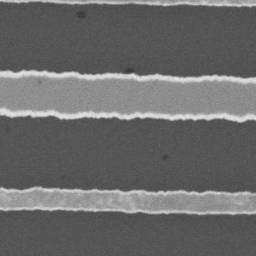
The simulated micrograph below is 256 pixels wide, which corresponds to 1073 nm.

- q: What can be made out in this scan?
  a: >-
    lines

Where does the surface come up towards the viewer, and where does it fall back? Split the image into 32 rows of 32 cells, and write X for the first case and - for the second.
--------------------XX----XXXXXX
--------------------------------
--------------------------------
--------------------------------
--------------------------------
--------------------------------
--------------------------------
--------------------------------
--------------------------------
XXXXXXXXXXXXXXXXX--X------------
XXXXXXXXXXXXXXXXXXXXXXXXXXXXXXXX
XXXXXXXXXXXXXXXXXXXXXXXXXXXXXXXX
XXXXXXXXXXXXXXXXXXXXXXXXXXXXXXXX
XXXXXXXXXXXXXXXXXXXXXXXXXXXXXXXX
-X--X--XXXXXXXXXXXXXXXXXXXXXXXXX
--------------------------------
--------------------------------
--------------------------------
--------------------------------
--------------------------------
--------------------------------
--------------------------------
--------------------------------
--------------------------------
XXXXXXXXXXXXXXXXXXXXXXXXXXXXXXXX
XXXXXXXXXXXXXXXXXXXXXXXXXXXXXXXX
------------------XXX--XXXXXXXXX
--------------------------------
--------------------------------
--------------------------------
--------------------------------
--------------------------------